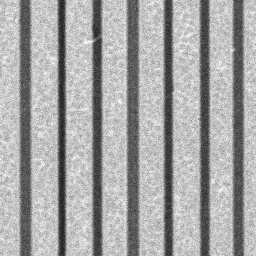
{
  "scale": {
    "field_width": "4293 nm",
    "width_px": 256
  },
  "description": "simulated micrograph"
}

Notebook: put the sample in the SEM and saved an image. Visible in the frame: parallel lines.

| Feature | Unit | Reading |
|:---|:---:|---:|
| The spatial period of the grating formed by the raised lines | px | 35.3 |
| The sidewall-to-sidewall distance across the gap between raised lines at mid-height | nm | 166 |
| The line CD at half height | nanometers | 434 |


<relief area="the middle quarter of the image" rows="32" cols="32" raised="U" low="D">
UUUUUUUDDDUUUUUDDDDUUUUUUDDUUUUU
UUUUUUUDDDUUUUUUDDDUUUUUUDDUUUUU
UUUUUUUDDDUUUUUUDDDUUUUUUDDUUUUU
UUUUUUUDDDUUUUUDDDDUUUUUUDDUUUUU
UUUUUUUDDDUUUUUUDDDUUUUUUDDDUUUU
UUUUUUUDDDUUUUUUDDDUUUUUUDDDUUUU
UUUUUUUDDDUUUUUUDDDUUUUUUDDDUUUU
UUUUUUUDDDUUUUUUDDDUUUUUUDDUUUUU
UUUUUUUDDDUUUUUUDDDUUUUUUDDUUUUU
UUUUUUUDDDUUUUUUDDDUUUUUUDDUUUUU
UUUUUUUDDDUUUUUUDDDUUUUUUDDUUUUU
UUUUUUUDDDUUUUUUDDDUUUUUUDDUUUUU
UUUUUUUDDDUUUUUUDDDUUUUUUDDUUUUU
UUUUUUUDDDUUUUUUDDDUUUUUUDDUUUUU
UUUUUUUDDDUUUUUUDDDUUUUUUDDUUUUU
UUUUUUUDDDUUUUUDDDDUUUUUUDDUUUUU
UUUUUUUDDDUUUUUDDDDUUUUUUDDUUUUU
UUUUUUUDDDUUUUUUDDDUUUUUUDDUUUUU
UUUUUUUDDDUUUUUUDDDUUUUUUDDUUUUU
UUUUUUUDDDUUUUUUDDDUUUUUUDDUUUUU
UUUUUUUDDDUUUUUUDDDUUUUUUDDUUUUU
UUUUUUUDDDUUUUUUDDDUUUUUUDDUUUUU
UUUUUUUDDDUUUUUDDDDUUUUUUDDUUUUU
DUUUUUUDDDUUUUUDDDDUUUUUUDDUUUUU
DUUUUUUDDDUUUUUUDDDUUUUUUDDUUUUU
DUUUUUUDDDUUUUUDDDDUUUUUUDDUUUUU
DUUUUUUDDDUUUUUDDDDUUUUUUDDUUUUU
DUUUUUUDDDUUUUUUDDDUUUUUUDDUUUUU
DUUUUUUDDDUUUUUUDDDUUUUUUDDUUUUU
DUUUUUUDDDUUUUUUDDDUUUUUUDDUUUUU
DUUUUUUDDDUUUUUDDDDUUUUUUDDUUUUU
DUUUUUUDDDUUUUUUDDDUUUUUUDDUUUUU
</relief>